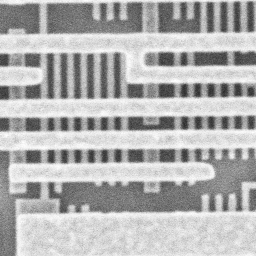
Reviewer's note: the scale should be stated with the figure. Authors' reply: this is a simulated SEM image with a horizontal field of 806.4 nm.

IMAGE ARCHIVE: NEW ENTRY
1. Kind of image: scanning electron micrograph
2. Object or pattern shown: wiring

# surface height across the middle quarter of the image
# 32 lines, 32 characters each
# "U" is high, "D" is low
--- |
DDDDDDDDDDDDDDDDUUUUDDDDDDDDDDDD
DDDDDDDDDDDDDDDDUUUUUUUUUUUUUUUU
DDDDDDDDDDDDDDDDUUUUUUUUUUUUUUUU
DDDDDDDDDDDDDDDDUUUUUUUUUUUUUUUU
DDDDDDDDDDDDDDDDUUUUUUUUUUUUUUUU
DDDDDDDDDDDDDDDDDDDDDDDDDDDDDDDD
DDDDDDDDDDDDDDDDDDDDDDDDDDDDDDDD
DDDDDDDDDDDDDDDDDDDDDDDDDDDDDDDD
DDDDDDDDDDDDDDDDDDDDDDDDDDDDDDDD
UUUUUUUUUUUUUUUUUUUUUUUUUUUUUUUU
UUUUUUUUUUUUUUUUUUUUUUUUUUUUUUUU
UUUUUUUUUUUUUUUUUUUUUUUUUUUUUUUU
UUUUUUUUUUUUUUUUUUUUUUUUUUUUUUUU
DDDDDDDDDDDDDDDDDDDDDDDDDDDDDDDD
DDDDDDDDDDDDDDDDDDDDDDDDDDDDDDDD
DDDDDDDDDDDDDDDDDDDDDDDDDDDDDDDD
DDDDDDDDDDDDDDDDDDDDDDDDDDDDDDDD
UUUUUUUUUUUUUUUUUUUUUUUUUUUUUUUU
UUUUUUUUUUUUUUUUUUUUUUUUUUUUUUUU
UUUUUUUUUUUUUUUUUUUUUUUUUUUUUUUU
UUUUUUUUUUUUUUUUUUUUUUUUUUUUUUUU
DDDDDDDDDDDDDDDDDDDDDDDDDDDDDDDD
DDDDDDDDDDDDDDDDDDDDDDDDDDDDDDDD
DDDDDDDDDDDDDDDDDDDDDDDDDDDDDDDD
DDDDDDDDDDDDDDDDDDDDDDDDDDDDDDDD
UUUUUUUUUUUUUUUUUUUUUUUUUUUUUUUU
UUUUUUUUUUUUUUUUUUUUUUUUUUUUUUUU
UUUUUUUUUUUUUUUUUUUUUUUUUUUUUUUU
UUUUUUUUUUUUUUUUUUUUUUUUUUUUUUUU
DDDDDDDDDDDDDDDDDDDDDDDDDDDDDDDD
DDDDDDDDDDDDDDDDDDDDDDDDDDDDDDDD
DDDDDDDDDDDDDDDDDDDDDDDDDDDDDDDD